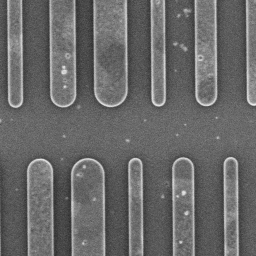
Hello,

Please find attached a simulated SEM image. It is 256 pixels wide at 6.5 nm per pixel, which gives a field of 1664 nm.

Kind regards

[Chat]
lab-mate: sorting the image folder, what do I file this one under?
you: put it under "groups of lines, slits or small figures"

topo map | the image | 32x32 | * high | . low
.**...***...****...*....***....*
.**...***...****...*....***....*
.**...***...****...*....***....*
.**...***...****...**...***....*
.**...***...****...**...***....*
.**...***...****...**...***....*
.**...***...****...**...***....*
.**...***...****...**...***....*
.**...***...****...**...***....*
.**...***...****...**...***....*
.**...***...****...**...***....*
.**...***...****...**...***....*
.**....**...***....**....**....*
................................
................................
................................
................................
................................
................................
................................
....**....**....**....**....**..
....***..****...**....**....**..
....***..****...**....**....**..
....***..****...**....**....**..
....***..****...**....**....**..
....***..****...**....**....**..
....***..****...**....**....**..
....***..****...**....**....**..
....***..****...**....**....**..
....***..****...**....**....**..
....***..****...**....**....**..
....***..****...**....**....**..